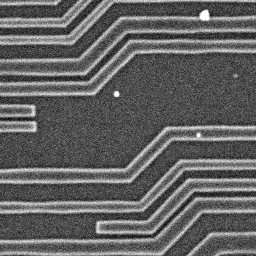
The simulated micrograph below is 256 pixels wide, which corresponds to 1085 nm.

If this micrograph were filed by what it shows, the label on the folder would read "groups of lines, slits or small figures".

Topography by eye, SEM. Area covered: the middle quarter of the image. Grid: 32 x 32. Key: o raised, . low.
oooooooo..ooooo.................
ooooooo..oooo...................
oooooo..oooo....................
.......oooo.....................
......ooooo.....................
oooooooooo......................
ooooooooo.......................
oooooooo.....o..................
................................
................................
................................
................................
................................
................................
................................
................................
.........................ooooooo
........................oooooooo
.......................ooooooooo
......................oooo......
.....................ooooo......
....................ooooo.......
...................ooooo........
..................ooooo.........
.................ooooo.......ooo
................ooooo.......oooo
oooooooooooooooooooo.......ooo..
ooooooooooooooooooo.......ooo...
oooooooooooooooooo.......ooo....
ooooo......ooooo........ooo...oo
.......................ooo...ooo
......................ooo...oooo